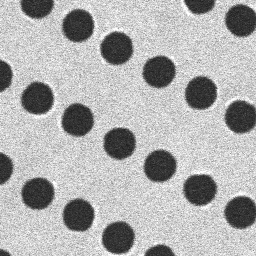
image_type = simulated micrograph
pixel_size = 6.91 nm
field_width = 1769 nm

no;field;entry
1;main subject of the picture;a regular array of holes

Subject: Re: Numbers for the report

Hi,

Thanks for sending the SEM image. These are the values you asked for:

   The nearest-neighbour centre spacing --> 0.318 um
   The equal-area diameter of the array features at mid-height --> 0.223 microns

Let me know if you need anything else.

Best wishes